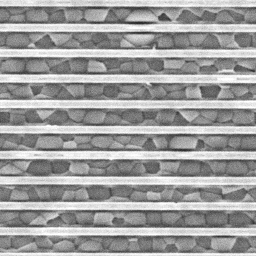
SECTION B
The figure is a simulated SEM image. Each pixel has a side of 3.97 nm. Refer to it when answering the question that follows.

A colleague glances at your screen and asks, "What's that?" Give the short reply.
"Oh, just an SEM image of parallel lines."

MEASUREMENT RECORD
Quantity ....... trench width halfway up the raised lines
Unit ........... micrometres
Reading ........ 0.071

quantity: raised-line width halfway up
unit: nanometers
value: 27.8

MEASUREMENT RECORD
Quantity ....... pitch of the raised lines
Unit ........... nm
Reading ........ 101